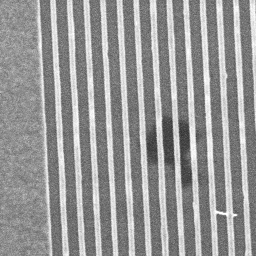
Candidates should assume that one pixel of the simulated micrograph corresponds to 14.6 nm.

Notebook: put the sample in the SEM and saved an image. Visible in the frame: parallel lines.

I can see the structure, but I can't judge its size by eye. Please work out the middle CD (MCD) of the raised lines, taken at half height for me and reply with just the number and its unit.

67.5 nm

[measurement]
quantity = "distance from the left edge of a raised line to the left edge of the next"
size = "16.6 pixels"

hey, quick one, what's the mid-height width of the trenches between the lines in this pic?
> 175 nm